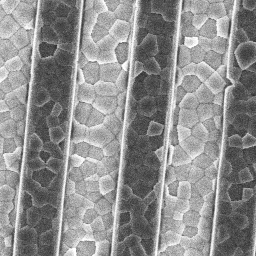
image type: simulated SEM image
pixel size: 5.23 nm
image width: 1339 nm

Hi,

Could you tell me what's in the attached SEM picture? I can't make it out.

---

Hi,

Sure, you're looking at one or a few lines or trenches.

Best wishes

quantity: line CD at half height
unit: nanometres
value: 234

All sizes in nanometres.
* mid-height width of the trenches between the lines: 279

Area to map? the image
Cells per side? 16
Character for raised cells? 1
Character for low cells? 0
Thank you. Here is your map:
0011100001100001
0011100011100011
0011100011100011
0011100011100011
0011100011100011
0011100011100011
0011100011100011
0011000011100011
0011000011100011
0111000011000011
0111000011000011
0111000111000011
0111000111000011
0111000111000111
0111000111000111
0111000111000111